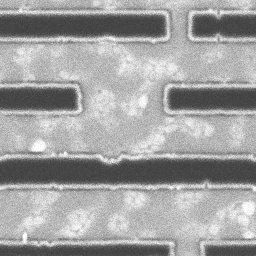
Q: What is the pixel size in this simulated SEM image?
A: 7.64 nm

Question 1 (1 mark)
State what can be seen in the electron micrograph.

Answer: one or a few lines or trenches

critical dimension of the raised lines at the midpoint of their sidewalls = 28.9 px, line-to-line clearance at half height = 45.1 px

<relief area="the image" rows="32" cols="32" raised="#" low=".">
................................
#####################...###.####
#####################...########
#####################...########
#####################...########
................................
................................
................................
................................
................................
................................
##########...........###########
##########...........###########
##########...........###########
................................
................................
................................
................................
....#...........................
.###########...#..########......
################################
################################
################################
#.............#................#
................................
................................
................................
................................
................................
................................
#####################....#######
######################...#######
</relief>